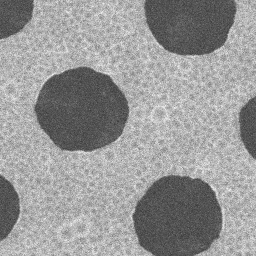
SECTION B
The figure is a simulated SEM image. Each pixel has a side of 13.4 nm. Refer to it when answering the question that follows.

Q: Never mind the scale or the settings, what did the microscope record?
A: holes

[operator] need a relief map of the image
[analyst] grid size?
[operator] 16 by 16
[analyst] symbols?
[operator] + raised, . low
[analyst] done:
..+++++++......+
..+++++++......+
++++++++++....++
++++++++++++++++
++++..++++++++++
+++....+++++++++
++......+++++++.
++......+++++++.
+++.....+++++++.
+++++.+++++++++.
++++++++++++++++
.+++++++++...+++
.++++++++.....++
.+++++++......++
.+++++++......++
+++++++++....+++